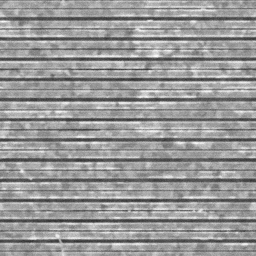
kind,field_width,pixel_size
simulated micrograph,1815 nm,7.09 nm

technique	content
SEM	parallel lines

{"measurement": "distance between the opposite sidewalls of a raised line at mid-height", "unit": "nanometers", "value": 48.7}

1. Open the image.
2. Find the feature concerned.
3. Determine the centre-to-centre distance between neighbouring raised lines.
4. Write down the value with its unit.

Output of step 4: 0.0718 µm